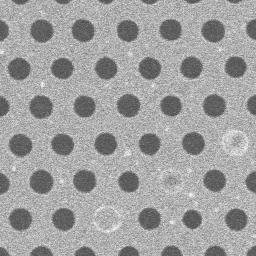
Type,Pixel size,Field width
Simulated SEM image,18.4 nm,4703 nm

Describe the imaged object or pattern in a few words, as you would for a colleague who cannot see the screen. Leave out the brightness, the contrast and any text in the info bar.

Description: a regular array of holes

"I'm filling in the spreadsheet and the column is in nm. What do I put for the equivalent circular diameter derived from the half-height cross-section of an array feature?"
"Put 431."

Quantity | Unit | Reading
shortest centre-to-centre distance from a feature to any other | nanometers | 782